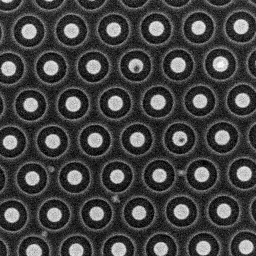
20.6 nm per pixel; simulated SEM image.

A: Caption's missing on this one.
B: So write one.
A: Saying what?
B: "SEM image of an array of small figures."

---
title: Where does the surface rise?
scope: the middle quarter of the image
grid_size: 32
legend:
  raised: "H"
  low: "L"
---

LHHLLLHHHLLHHHLLHHHHLLHHHLLHHHLL
LHHLLLHHHLLHHHLLLHHLLLHHHLLHHHLL
HHHHLLLLLLLHHHHLLLLLLHHHHLLLLLLL
HHHHHLLLLLHHHHHLLLLLLHHHHHLLLLLH
HHHHHHLLHHHHHHHHHHLHHHHHHHHHHHHH
HHHHHHHHHHHHHHHHHHHHHHHLHHHHHHHH
LLLLHHHHHHHLLLLHHHHHHLLLLLHHHHHL
LLLLLHHHHHLLLLLLHHHHLLLLLLLHHHLL
LLHLLLHHHLLLHHLLLHHHLLHHHLLHHHLL
LHHHLLHHHLLHHHLLLHHLLLHHHLLHHHLL
LHHHLLHHHLLHHHLLLHHHLLHHHLLHHHLL
LHHLLLHHHLLLHLLLHHHHLLLLLLLHHHHL
LLLLLHHHHHLLLLLLHHHHHLLLLLHHHHHH
LLLLHHHHHHHLLLHHHHHHHHHLHHHHHHHH
HHHHHHHHHHHHHHHHHHHHHHHHHHHHHHHH
HHHHHHLLLLHHHHHHLLLLHHHHHHLLLLLH
HHHHHLLLLLLHHHHLLLLLLHHHHHLLLLLL
LHHHLLLHHLLHHHHLLHHLLLHHHLLLHHLL
LHHHLLHHHLLLHHLLLHHHLLHHHLLHHHHL
LHHHLLHHHLLLHHLLLHHHLLHHHLLHHHLL
LHHHLLLHHLLHHHHLLLHLLLHHHLLLLLLL
LHHHHLLLLLLHHHHHLLLLLHHHHHLLLLLL
HHHHHHLLLLHHHHHHHLLLHHHHHHHHLLHH
HHHHHHHHHHHHHHHHHHHHHHHHHHHHHHHH
HHLHHHHHHHHHLLHHHHHHHHLLLLHHHHHH
LLLLLHHHHHLLLLLLHHHHHLLLLLLHHHHL
LLLLLLHHHHLLLLLLLHHHLLLHHLLLHHHL
LHHHLLHHHLLLHHHLLHHHLLHHHLLLHHLL
LHHHLLLHHLLLHHHLLHHHLLHHHLLLHHHL
LHHHLLHHHHLLHHLLLHHHLLLLLLLHHHHL
LLLLLLHHHHLLLLLLHHHHHLLLLLLHHHHH
LLLLLHHHHHHLLLLHHHHHHHLLLLHHHHHH